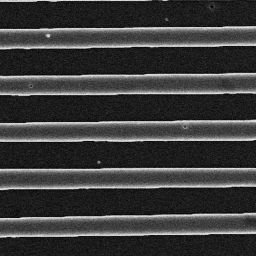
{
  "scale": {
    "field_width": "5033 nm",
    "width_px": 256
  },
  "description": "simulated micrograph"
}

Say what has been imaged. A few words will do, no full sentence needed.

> lines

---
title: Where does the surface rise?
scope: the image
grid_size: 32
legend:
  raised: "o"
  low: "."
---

................................
................................
................................
....................oooooooooooo
oooooooooooooooooooooooooooooooo
oooooooooooooooooooooooooooooooo
................................
................................
................................
...........ooooooooooooooooooooo
oooooooooooooooooooooooooooooooo
oooooooooooooooooooooooooooooooo
................................
................................
................................
oooooooooooooooooooooooooooooooo
oooooooooooooooooooooooooooooooo
ooooooooooooooooooooooooooooooo.
................................
................................
................................
oooooooooooooooooooooooooooooooo
oooooooooooooooooooooooooooooooo
ooooooooo.......................
................................
................................
................................
oooooooooooooooooooooooooooooooo
oooooooooooooooooooooooooooooooo
oooooooo........................
................................
................................